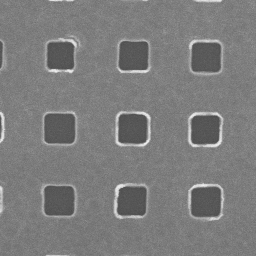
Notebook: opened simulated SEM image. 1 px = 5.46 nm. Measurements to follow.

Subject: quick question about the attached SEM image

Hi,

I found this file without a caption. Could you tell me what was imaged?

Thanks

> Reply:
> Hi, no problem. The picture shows a regular array of holes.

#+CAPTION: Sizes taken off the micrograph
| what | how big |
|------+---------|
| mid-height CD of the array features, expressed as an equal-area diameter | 182 nanometres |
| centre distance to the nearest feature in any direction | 0.395 µm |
